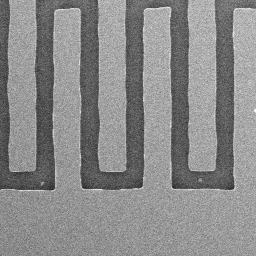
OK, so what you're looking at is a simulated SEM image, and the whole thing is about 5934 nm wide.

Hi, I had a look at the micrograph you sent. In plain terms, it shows groups of lines, slits or small figures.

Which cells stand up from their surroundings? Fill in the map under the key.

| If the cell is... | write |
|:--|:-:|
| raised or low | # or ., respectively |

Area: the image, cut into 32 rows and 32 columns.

.###........####........###.....
.###...###..####..###...###..###
.###...###..####..###...###..###
.###...###..####..###...###..###
.###...###..####..###...###..###
.###...###..####..###...###..###
.###...###..####..###...###..###
.###...###..####..###...###..###
.###...###..####..###...###..###
.###...###..####..###...###..###
.###...###..####..###...###..###
.###...###..####..###...###..###
.###...###..####..###...###..###
.###...###..####..###...###..###
.###...###..####..###...###..###
.###...###...###..###...###..###
.###...###..####..###...###..###
.###...###..####..###...###..###
.###...###..####..###...###..###
.###...###..####..###...###..###
.###...###..####..###...###..###
.......###........###........###
.......###........###........###
.......####......#####.......###
################################
################################
################################
################################
################################
################################
################################
################################